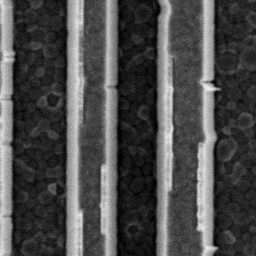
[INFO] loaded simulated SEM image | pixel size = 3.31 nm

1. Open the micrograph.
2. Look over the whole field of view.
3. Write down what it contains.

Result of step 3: one or a few lines or trenches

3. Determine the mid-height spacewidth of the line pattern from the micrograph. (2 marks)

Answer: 190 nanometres